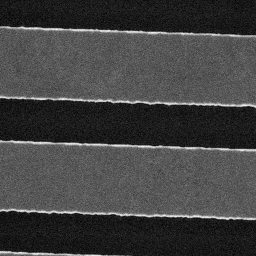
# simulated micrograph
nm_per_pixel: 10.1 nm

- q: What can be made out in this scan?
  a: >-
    lines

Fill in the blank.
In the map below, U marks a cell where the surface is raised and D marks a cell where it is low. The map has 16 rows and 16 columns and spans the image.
DDDDDDDDDDDDDDDD
DDDDDDDDDDDDDDDD
UUUUUUUUUUUUUUUU
UUUUUUUUUUUUUUUU
UUUUUUUUUUUUUUUU
UUUUUUUUUUUUUUUU
DDDDDDDDDDDUUUUU
DDDDDDDDDDDDDDDD
DDDDDDDDDDDDDDDD
UUUUUUUUUUUUUUUU
UUUUUUUUUUUUUUUU
UUUUUUUUUUUUUUUU
UUUUUUUUUUUUUUUU
DDDDDDDDDUUUUUUU
DDDDDDDDDDDDDDDD
DDDDDDDDDDDDDDDD